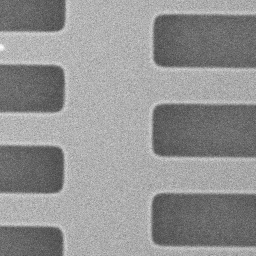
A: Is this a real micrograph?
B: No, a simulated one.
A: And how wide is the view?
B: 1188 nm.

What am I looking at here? groups of lines, slits or small figures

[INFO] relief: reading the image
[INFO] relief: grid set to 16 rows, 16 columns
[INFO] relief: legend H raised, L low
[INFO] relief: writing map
LLLLHHHHHHHHHHHH
LLLLHHHHHHLLLLLL
HHHHHHHHHHLLLLLL
HHHHHHHHHHLLLLLL
LLLLHHHHHHHHHHHH
LLLLHHHHHHHHHHHH
LLLLHHHHHHLLLLLL
HHHHHHHHHLLLLLLL
HHHHHHHHHLLLLLLL
LLLLHHHHHHLLLLLL
LLLLHHHHHHHHHHHH
LLLLHHHHHHHHHHHH
HHHHHHHHHHLLLLLL
HHHHHHHHHLLLLLLL
LLLLHHHHHLLLLLLL
LLLLHHHHHHHHHLLL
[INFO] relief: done